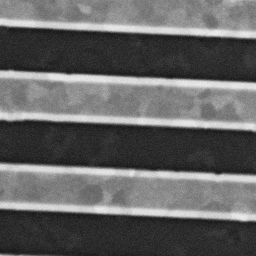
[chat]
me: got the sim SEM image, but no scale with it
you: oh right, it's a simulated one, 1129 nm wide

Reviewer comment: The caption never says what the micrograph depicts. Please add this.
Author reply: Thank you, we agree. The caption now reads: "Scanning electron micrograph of one or a few lines or trenches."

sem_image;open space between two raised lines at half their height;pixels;51.7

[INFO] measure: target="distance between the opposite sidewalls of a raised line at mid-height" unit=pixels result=39.7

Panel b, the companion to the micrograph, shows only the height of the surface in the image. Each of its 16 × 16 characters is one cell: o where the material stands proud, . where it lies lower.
oooooooooooooooo
..oooooooooooooo
................
................
................
oooooooooooooooo
oooooooooooooooo
.......ooooooooo
................
................
oo..............
oooooooooooooooo
oooooooooooooooo
..............oo
................
................